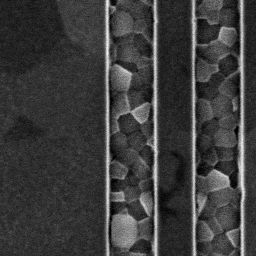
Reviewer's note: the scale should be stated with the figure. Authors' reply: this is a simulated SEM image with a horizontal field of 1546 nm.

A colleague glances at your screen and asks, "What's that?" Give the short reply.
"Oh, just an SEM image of one or a few lines or trenches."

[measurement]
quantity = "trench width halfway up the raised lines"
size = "288 nanometers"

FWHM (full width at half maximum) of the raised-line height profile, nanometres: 232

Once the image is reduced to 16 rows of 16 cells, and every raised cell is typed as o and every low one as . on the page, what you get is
ooooooo...oo...o
ooooooo...oo...o
ooooooo...oo...o
ooooooo...oo...o
ooooooo...oo...o
ooooooo...oo...o
ooooooo...oo...o
ooooooo...oo...o
ooooooo...oo...o
ooooooo...oo...o
ooooooo...oo...o
ooooooo...oo...o
ooooooo...oo...o
ooooooo...oo...o
oooooooo..oo...o
ooooooo...oo...o